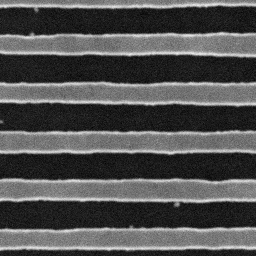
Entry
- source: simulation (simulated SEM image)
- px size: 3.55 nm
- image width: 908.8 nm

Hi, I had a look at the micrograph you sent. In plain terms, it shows lines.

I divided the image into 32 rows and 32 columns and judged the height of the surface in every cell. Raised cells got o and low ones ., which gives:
oooooooooooooooooooooooooooooooo
................................
................................
................................
ooo..ooooooooooooooooooooooooooo
oooooooooooooooooooooooooooooooo
oooooooooooooooooooooooooooooooo
................................
................................
................................
oooooooooooooooo...ooooooooooooo
oooooooooooooooooooooooooooooooo
oooooooooooooooooooooooooooooooo
................................
................................
................................
oooo..ooo.ooooo.oooo..oo...ooooo
oooooooooooooooooooooooooooooooo
oooooooooooooooooooooooooooooooo
................................
................................
................................
ooo..............o...oo.........
oooooooooooooooooooooooooooooooo
oooooooooooooooooooooooooooooooo
................................
................................
................................
................................
oooooooooooooooooooooooooooooooo
oooooooooooooooooooooooooooooooo
................................